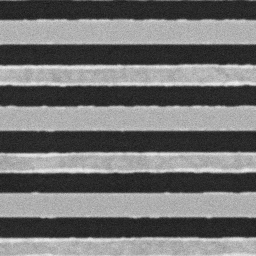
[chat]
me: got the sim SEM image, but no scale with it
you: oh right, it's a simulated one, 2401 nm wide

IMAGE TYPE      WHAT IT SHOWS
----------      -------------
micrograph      lines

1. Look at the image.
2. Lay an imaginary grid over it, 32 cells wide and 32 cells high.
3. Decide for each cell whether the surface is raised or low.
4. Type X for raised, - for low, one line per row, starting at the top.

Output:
--------------------------------
--------------------------------
--------------------------------
XXXXXXXXXXXXXXXXXXXXXXXXXXXXXXXX
XXXXXXXXXXXXXXXXXXXXXXXXXXXXXXXX
X-------------------------------
--------------------------------
--------------------------------
XXXXXXXXXXXXXXXXXXXXXXXXXXXXXXXX
XXXXXXXXXXXXXXXXXXXXXXXXXXXXXXXX
XXXXXXXXXXXXXXXXXXXXXXXXXXXXXX-X
--------------------------------
--------------------------------
XXXXXXXXXXXXXXXXXXXXXXXXXXXXXXXX
XXXXXXXXXXXXXXXXXXXXXXXXXXXXXXXX
XXXXXXXXXXXXXXXXXXXXXXXXXXXXXXXX
--------------------------------
--------------------------------
--------------------------------
XXXXXXXXXXXXXXXXXXXXXXXXXXXXXXXX
XXXXXXXXXXXXXXXXXXXXXXXXXXXXXXXX
X-X-----------------------------
--------------------------------
--------------------------------
XXXXXXXXXXXXXXXXXXXXXXXXXXXXXXXX
XXXXXXXXXXXXXXXXXXXXXXXXXXXXXXXX
XXXXXXXXXXXXXXXXXXXXXXXXXXXXXXXX
--------------------------------
--------------------------------
--------------------------------
XXXXXXXXXXXXXXXXXXXXXXXXXXXXXXXX
XXXXXXXXXXXXXXXXXXXXXXXXXXXXXXXX